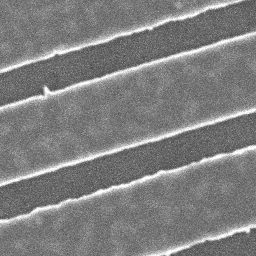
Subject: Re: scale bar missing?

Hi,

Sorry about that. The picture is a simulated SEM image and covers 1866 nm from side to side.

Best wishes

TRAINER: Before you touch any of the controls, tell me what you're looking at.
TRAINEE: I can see one or a few lines or trenches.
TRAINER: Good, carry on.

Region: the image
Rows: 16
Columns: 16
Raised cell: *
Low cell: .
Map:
*************...
**********......
*******.......**
***........*****
........********
....************
.***************
**************..
**********......
*******........*
****.......*****
........********
....************
.***************
***************.
************....